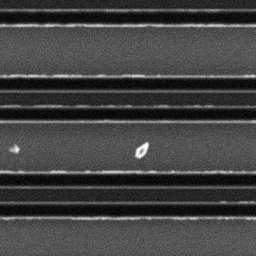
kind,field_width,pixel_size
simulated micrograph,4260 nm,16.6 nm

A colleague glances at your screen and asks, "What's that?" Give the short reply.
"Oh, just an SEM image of lines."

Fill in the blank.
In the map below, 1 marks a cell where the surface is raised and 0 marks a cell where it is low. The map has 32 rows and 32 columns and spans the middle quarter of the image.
00000000000000000000000000000000
00000000000000000000000000000000
00000000000000000000000000000000
11111111111111111111111111111111
11111111111111111111111111111111
11111111111111111111111111111111
11111111111111111111111111111111
00000000000000000000000000000000
00000000000000000000000000000000
00000000000000000000000000000000
00000000000000000000000000000000
11111111111111111111111111111111
11111111111111111111111111111111
11111111111111111111111111111111
00000000000000000000000000000000
00000000000000000000000000000000
00000000000000000000000000000000
00000000000000000000000000000000
00000000000000000000000000000000
00000000000000000000000000000000
00000000000000000000000000000000
00000000000000000000000000000000
00000000000000000000000000000000
00000000000000000000000000000000
00000000000000000000000000000000
00000000000000000000000000000000
00000000000000000000000000000000
11111111111111111111111111111111
11111111111111111111111111111111
11111111111111111111111111111111
11111111111111111111111111111111
00000000000000000000000000000000